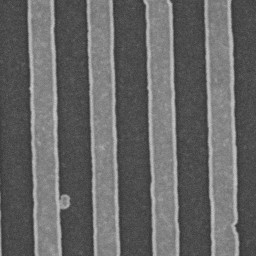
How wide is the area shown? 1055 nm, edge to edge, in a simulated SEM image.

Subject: parallel lines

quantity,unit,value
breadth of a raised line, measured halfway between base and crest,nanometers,95.7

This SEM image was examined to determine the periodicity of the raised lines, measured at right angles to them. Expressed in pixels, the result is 59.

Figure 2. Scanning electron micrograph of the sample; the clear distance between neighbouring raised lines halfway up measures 147 nanometres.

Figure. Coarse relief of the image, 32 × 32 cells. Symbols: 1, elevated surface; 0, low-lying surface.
00001100000111000011100000111000
00001110000111000011100000111000
00001110000111000011100000111000
00001110000111000011100000111000
00001110000111000001100000111000
00001110000111000011100000111000
00001110000111000001100000111000
00001110000111000001110000111000
00001110000111000001110000111000
00001110000111000001100000111000
00001110000111000001110000111000
00001110000111000001110000111000
00001110000111000001110000111000
00001110000111000001110000111000
00001110000111000001110000111000
00001110000111000001110000111000
00001110000011000001110000111000
00001110000011000001110000111000
00001110000011000001110000111000
00001110000011000001110000111000
00001110000011000001110000111000
00001110000011100001110000111000
00001110000011100001110000111000
00001110000011100001110000111000
00001110000011100001110000111000
00001110000011100001110000011000
00001110000011100001110000011000
00001110000011100001110000011000
00001110000011100001110000011000
00000110000011100001110000011100
00000110000011100001110000011100
00001111000011100001110000011100